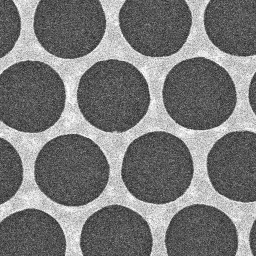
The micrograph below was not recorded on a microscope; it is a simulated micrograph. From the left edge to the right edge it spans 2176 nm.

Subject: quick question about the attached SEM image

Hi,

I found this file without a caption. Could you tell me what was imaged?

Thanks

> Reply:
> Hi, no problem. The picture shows holes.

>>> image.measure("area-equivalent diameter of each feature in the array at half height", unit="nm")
628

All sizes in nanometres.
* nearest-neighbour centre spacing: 720